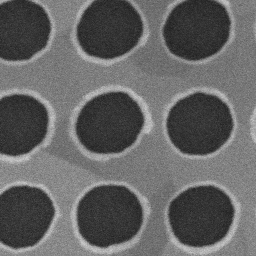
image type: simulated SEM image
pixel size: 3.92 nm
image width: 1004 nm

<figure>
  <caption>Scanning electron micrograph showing holes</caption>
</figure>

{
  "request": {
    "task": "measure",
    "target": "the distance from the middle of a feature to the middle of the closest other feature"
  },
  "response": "357 nm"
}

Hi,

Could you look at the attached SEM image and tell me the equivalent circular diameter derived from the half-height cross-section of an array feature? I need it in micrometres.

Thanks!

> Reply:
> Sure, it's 0.266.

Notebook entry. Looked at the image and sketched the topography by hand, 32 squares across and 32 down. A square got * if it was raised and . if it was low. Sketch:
.....******......*****......****
......****.......****........***
......****........***........***
.......**.........**.........***
......***.........**.........***
......****.......****.......****
.....*****......*****......*****
....********..*********...******
********************************
********************************
********************************
*************...********..******
.....******......*****......****
......****........***........***
......****........***........***
......***.........***........***
......***.........***........***
......****.......****........***
.....*****......******......****
...********************...******
********************************
********************************
********************************
*....******.....*******.....****
......****.......*****.......***
.......***........***........***
.......**.........***........***
.......**.........***........***
......***.........***........***
......****.......*****......****
.....******....********....*****
********************************